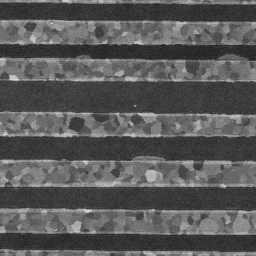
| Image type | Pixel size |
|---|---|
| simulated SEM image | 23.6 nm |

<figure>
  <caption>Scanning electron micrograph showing lines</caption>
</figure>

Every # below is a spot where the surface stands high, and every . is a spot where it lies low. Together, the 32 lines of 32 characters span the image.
................................
................................
................................
################################
################################
..........................#.....
................................
#####.##........................
################################
################################
................................
................................
................................
................................
###########################.....
################################
################################
................................
................................
................................
################################
################################
################################
................................
................................
................................
################################
################################
################################
................................
................................
##############..................